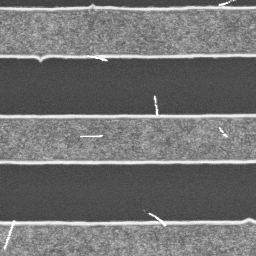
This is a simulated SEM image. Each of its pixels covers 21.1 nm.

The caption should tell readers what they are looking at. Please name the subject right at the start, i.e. one or a few lines or trenches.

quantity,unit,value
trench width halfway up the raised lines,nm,1270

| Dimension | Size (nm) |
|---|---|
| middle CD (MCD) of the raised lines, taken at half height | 979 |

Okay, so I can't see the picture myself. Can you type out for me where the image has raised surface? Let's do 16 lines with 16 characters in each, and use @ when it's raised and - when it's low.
-----@@-----@@--
@@@@@@@@@@@@@@@@
@@@@@@@@@@@@@@@@
-@@-@@@@@@@@----
----------------
----------------
----------------
@@@@@@@@@@@@@@@@
@@@@@@@@@@@@@@@@
@@@@@@@@@@@@@@@@
----------------
----------------
----------------
----------------
@@@@@@@@@@@@@@@@
@@@@@@@@@@@@@@@@